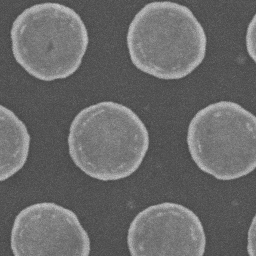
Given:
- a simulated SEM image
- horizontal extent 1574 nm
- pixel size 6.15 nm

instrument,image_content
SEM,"raised bodies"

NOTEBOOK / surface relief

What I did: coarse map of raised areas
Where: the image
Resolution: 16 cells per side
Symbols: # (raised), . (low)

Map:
..##.....##.....
.####...####....
.####...#####...
.####...#####...
..##......##....
................
................
#....####...####
##..#####...####
##...####...####
#....###.....###
................
................
.###.....###....
.####...#####...
.####...#####...